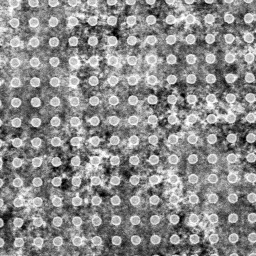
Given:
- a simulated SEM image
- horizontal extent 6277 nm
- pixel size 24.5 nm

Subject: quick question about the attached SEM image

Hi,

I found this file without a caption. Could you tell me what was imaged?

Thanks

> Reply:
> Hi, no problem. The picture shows a regular array of raised bodies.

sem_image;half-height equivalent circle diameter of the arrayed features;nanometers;218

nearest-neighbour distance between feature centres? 476 nm